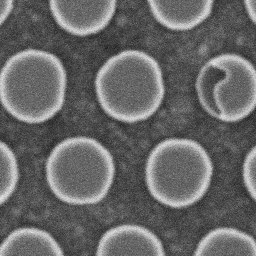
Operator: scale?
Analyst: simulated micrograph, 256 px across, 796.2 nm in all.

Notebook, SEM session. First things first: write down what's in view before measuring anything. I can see raised bodies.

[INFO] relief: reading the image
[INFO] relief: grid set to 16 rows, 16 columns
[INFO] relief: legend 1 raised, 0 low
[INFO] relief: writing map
1001111000111001
0000111000110000
0000000000000000
0110000110000000
1111001111000111
1111001111001111
1111001111000111
0110000000000010
0000000000000000
1001111000111000
1001111001111001
1001111001111001
0000110000110000
0000000000000000
0110000110000110
1111001111001111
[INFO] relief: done